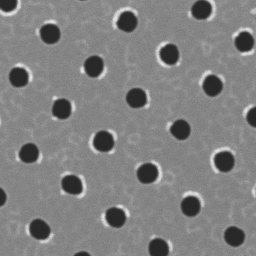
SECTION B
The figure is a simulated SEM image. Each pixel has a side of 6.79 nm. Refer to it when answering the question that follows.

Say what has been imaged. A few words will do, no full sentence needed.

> a regular array of holes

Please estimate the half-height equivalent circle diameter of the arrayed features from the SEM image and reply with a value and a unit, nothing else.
142 nm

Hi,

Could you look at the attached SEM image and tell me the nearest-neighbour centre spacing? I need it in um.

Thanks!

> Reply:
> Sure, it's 0.362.